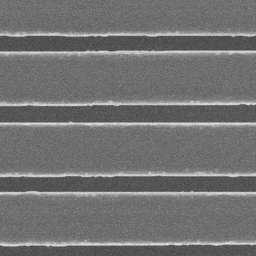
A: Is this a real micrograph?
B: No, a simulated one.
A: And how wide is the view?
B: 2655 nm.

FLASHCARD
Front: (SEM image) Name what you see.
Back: lines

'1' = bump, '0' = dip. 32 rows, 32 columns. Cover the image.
11111111111111111111111111111111
11111111111111111111111111111111
11111111111111111111111111111111
11111111111111111111111111111111
01110000111010000011000000000001
00000000000000000000000000000000
00000000000010110000111111111111
11111111111111111111111111111111
11111111111111111111111111111111
11111111111111111111111111111111
11111111111111111111111111111111
11111111111111111111111111111111
11111111111111111111111111111111
00000000000000000000000000000000
00000000000000000000000000000000
11111111111111111111111111111111
11111111111111111111111111111111
11111111111111111111111111111111
11111111111111111111111111111111
11111111111111111111111111111111
11111111111111111111111111111111
11111111111111111111111111111111
00000000000000000000000000000000
00000000000000000000000000000000
11111111111111111111111111111111
11111111111111111111111111111111
11111111111111111111111111111111
11111111111111111111111111111111
11111111111111111111111111111111
11111111111111111111111111111111
11111111111111111111111111111111
00000000000000000000000000000000